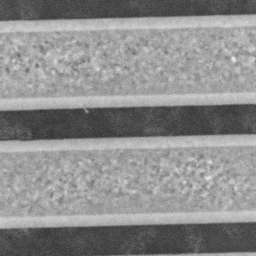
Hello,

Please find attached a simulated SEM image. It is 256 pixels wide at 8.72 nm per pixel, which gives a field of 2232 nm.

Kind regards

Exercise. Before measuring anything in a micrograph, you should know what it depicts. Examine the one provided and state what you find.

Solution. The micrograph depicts one or a few lines or trenches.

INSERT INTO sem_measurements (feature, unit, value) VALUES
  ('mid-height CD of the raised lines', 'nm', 690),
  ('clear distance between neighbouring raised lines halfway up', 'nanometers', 349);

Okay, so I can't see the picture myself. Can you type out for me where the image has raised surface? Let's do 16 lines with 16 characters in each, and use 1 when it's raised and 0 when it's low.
0000000000000000
0000011111111111
1111111111111111
1111111111111111
1111111111111111
1111111111111111
1111000000000000
0000000000000000
0000000000000000
1111111111111111
1111111111111111
1111111111111111
1111111111111111
1111111111111111
0000000000000000
0000000000000000